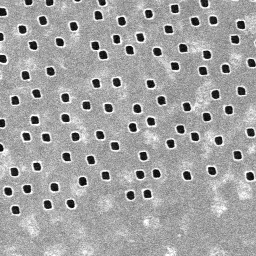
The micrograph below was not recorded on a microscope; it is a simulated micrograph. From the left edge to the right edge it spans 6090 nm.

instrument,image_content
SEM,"a regular array of holes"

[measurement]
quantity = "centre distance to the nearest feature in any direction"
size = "479 nm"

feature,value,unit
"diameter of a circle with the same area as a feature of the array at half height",218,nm